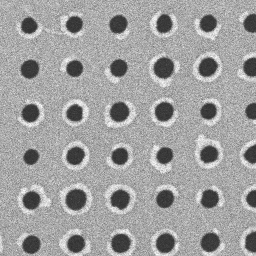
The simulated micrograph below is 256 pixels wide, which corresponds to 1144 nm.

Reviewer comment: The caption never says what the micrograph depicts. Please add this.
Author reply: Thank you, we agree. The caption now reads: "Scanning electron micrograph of a regular array of holes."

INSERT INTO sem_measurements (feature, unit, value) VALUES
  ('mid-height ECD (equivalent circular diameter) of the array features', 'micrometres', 0.0797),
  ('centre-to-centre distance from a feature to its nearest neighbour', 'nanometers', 195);